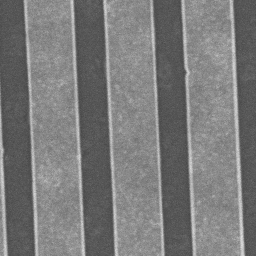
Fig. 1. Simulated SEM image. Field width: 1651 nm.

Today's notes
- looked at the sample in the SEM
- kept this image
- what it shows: one or a few lines or trenches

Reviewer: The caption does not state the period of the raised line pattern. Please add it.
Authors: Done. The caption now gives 510 nm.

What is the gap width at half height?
205 nm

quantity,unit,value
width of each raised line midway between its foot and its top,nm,301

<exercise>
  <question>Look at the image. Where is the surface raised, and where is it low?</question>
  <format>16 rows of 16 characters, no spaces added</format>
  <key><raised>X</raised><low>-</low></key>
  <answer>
--XXX--XX--XXX--
--XXX--XXX--XXX-
--XXX--XXX--XXX-
--XXX--XXX--XXX-
--XXX--XXX--XXX-
--XXX--XXX--XXX-
--XXX--XXX--XXX-
--XXX--XXX--XXX-
--XXX--XXX--XXX-
--XXX--XXX--XXX-
--XXX--XXX--XXX-
--XXX--XXX--XXX-
--XXX--XXX--XXX-
--XXX--XXX--XXX-
--XXX--XXX--XXX-
--XXX--XXX--XXX-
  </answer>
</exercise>